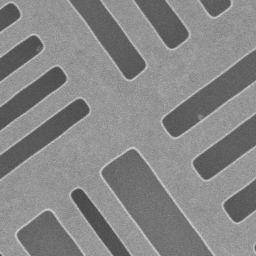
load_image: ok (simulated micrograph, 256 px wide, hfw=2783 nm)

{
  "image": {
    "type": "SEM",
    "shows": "groups of lines, slits or small figures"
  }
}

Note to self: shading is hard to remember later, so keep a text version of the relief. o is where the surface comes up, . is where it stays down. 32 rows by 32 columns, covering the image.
o.ooooooo....oooo....oooo....ooo
..oooooooo....oooo....oooo..oooo
..oooooooo....oooo....oooooooooo
.oooooooooo....oooo....ooooooooo
oooooooooooo....oooo...ooooooooo
oo...oooooooo...ooooo..ooooooooo
o....oooooooo....oooooooooooooo.
....oooooooooo....oooooooooooo..
..ooooooooooooo...ooooooooooo...
.oooo...ooooooo..oooooooooo.....
oooo....oooooooooooooooooo.....o
oo.....oooooooooooooooooo.....oo
o....oooooooooooooooooo......ooo
....oooo...ooooooooooo.....ooooo
..ooooo....oooooooooo.....oooooo
.oooo....ooooooooooo.....ooooo..
oooo....ooooooooooooo..oooooo...
ooo....ooooooooooooooooooooo....
o....ooooooooooooooooooooo......
....ooooooooooo...ooooooo.....oo
...oooooooooo.....oooooo.....ooo
.oooooooooooo......oooooo..ooooo
ooooooooooooo.......oooooooooooo
oooooooooooooo......oooooooooo..
ooooooooo..ooo.......oooooooo...
ooooooooo...ooo.......oooooo....
ooooo.oooo..oooo.......ooooo....
oooo...oooo..oooo......oooooo.oo
ooo.....oooo..ooo.......oooooooo
oo.......ooo...ooo.......ooooooo
ooo......oooo..oooo.......oooooo
ooo.......oooo..oooo......oooooo